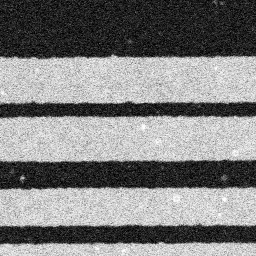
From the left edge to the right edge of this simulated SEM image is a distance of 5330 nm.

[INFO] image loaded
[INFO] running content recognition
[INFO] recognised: one or a few lines or trenches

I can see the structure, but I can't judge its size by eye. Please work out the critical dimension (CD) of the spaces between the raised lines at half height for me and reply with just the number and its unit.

0.885 um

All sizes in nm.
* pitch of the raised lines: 1300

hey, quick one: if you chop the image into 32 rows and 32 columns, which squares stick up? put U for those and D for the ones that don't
UUUUUUUUUUUUUUUUUUUUUUUUUUUUUUUU
UUUUUUUUUUUUUUUUUUUUUUUUUUUUUUUU
UUUUUUUUUUUUUUUUUUUUUUUUUUUUUUUU
UUUUUUUUUUUUUUUUUUUUUUUUUUUUUUUU
UUUUUUUUUUUUUUUUUUUUUUUUUUUUUUUU
UUUUUUUUUUUUUUUUUUUUUUUUUUUUUUUU
UUUUUUUUUUUUUUUUUUUUUUUUUUUUUUUU
DDDDDUDDDDDDDDDDDDDDDDDDDDDDDDDD
DDDDDDDDDDDDDDDDDDDDDDDDDDDDDDDD
DDDDDDDDDDDDDDDDDDDDDDDDDDDDDDDD
DDDDDDDDDDDDDDDDDDDDDDDDDDDDDDDD
DDDDDDDDDDDDDDDDDDDDDDDDDDDDDDDD
DDDDDDDDDDDDDDDDDDDDDDDDDDDDDDDD
UUUUUUUUUUUUUUUUUUUUUUUUUUUUUUUU
UUUUUUUUUUUUUUUUUUUUUUUUUUUUUUUU
DDDDDDDDDDDDDDDDDDDDDDDDDDDDDDDD
DDDDDDDDDDDDDDDDDDDDDDDDDDDDDDDD
DDDDDDDDDDDDDDDDDDDDDDDDDDDDDDDD
DDDDDDDDDDDDDDDDDDDDDDDDDDDDDDDD
DDDDDDDDDDDDDDDDDDDDDDDDDDDDDDDD
UUUUUUUUUUUUUUUUUUUUUUUUUUUUUUUU
UUUUUUUUUUUUUUUUUUUUUUUUUUUUUUUU
UUUUUUUUUUUUUUUUUUUUUUUUUUUUUUUU
UUUUUUUUUUUUUUUUUUUUUUUUUUUUUUUU
DDDDDDDDDDDDDDDDDDDDDDDDDDDDDDDD
DDDDDDDDDDDDDDDDDDDDDDDDDDDDDDDD
DDDDDDDDDDDDDDDDDDDDDDDDDDDDDDDD
DDDDDDDDDDDDDDDDDDDDDDDDDDDDDDDD
UUUUUUUUUUUUUUUUUUUUUUUUUUUUUUUU
UUUUUUUUUUUUUUUUUUUUUUUUUUUUUUUU
UUUUUUUUUUUUUUUUUUUUDUDDDDDDDDDD
DDDDDDDDDDDDDDDDDDDDDDDDDDDDDDDD